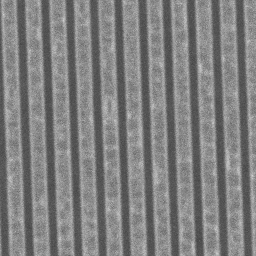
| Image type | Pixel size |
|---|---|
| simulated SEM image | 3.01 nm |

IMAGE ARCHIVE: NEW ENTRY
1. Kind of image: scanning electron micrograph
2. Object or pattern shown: parallel lines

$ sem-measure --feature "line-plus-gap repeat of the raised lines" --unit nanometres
73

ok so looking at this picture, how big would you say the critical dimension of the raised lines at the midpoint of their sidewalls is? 44.3 nm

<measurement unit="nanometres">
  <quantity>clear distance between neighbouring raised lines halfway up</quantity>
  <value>30.4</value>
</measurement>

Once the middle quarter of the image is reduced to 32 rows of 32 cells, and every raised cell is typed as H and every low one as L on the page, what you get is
HLLHHHHLLHHHHLLHHHHLLLHHHLLLHHHL
HLLHHHHLLHHHHLLHHHHLLLHHHLLLHHHL
HLLHHHHLLHHHHLLHHHHLLLHHHLLLHHHL
HLLHHHHLLHHHHLLHHHHLLHHHHLLLHHHL
HLLHHHHLLLHHHLLHHHHLLLHHHLLLHHHL
HLLLHHHLLLHHHLLLHHHLLLHHHLLLHHHL
HLLLHHHLLLHHHLLLHHHLLLHHHLLLHHHL
HLLLHHHLLLHHHLLLHHHLLLHHHLLLHHHL
HLLLHHHLLLHHHLLLHHHLLLHHHLLLHHHL
HLLLHHHLLLHHHLLLHHHLLLHHHLLLHHHL
HLLLHHHLLLHHHLLLHHHLLLHHHLLLHHHL
HLLLHHHLLLHHHLLLHHHLLLHHHLLLHHHL
HLLLHHHLLLHHHLLLHHHLLLHHHLLLHHHL
HLLLHHHLLLHHHLLLHHHLLLHHHLLLHHHL
HLLLHHHLLLHHHLLLHHHLLLHHHLLLHHHL
HLLLHHHLLLHHHLLLHHHLLLHHHLLLHHHL
HLLLHHHLLLHHHLLLHHHLLLHHHLLLHHHL
HLLLHHHLLLHHHLLLHHHLLLHHHLLLHHHL
HLLLHHHLLLHHHLLLHHHLLLHHHLLLHHHH
HLLLHHHLLLHHHLLLHHHLLLHHHHLLHHHH
HLLLHHHLLLHHHLLLHHHHLLHHHHLLHHHH
HLLLHHHLLLHHHHLLHHHHLLHHHHLLHHHH
HLLLHHHHLLHHHHLLHHHHLLHHHHLLHHHH
HLLLHHHHLLHHHHLLHHHHLLHHHHLLHHHH
HLLLHHHLLLHHHHLLHHHHLLHHHHLLHHHH
HLLLHHHLLLHHHHLLHHHHLLHHHHLLLHHH
HLLLHHHLLLHHHHLLHHHHLLLHHHLLLHHH
HLLLHHHLLLHHHHLLHHHHLLLHHHLLLHHH
HLLLHHHHLLHHHHLLHHHHLLLHHHLLLHHH
HHLLHHHHLLHHHHLLHHHHLLLHHHLLLHHH
HHLLHHHHLLLHHHLLHHHHLLLHHHLLLHHH
HHLLHHHHLLHHHHLLHHHHLLLHHHLLLHHH